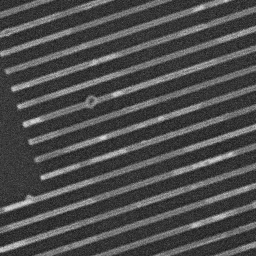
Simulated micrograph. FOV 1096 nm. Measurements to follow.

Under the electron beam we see parallel lines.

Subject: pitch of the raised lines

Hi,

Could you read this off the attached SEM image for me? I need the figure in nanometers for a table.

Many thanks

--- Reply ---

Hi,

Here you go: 79.7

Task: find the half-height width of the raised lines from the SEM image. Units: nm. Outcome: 19.3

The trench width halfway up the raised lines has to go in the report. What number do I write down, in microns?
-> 0.0625